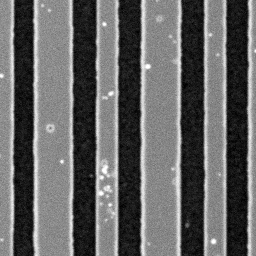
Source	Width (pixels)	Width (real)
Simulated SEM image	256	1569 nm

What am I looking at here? lines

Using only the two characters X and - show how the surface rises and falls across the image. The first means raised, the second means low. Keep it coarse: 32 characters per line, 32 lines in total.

XX--XXXXX---XXX---XXXXX---XX---X
XX--XXXXX---XXX---XXXXX---XX---X
XX--XXXXX---XXX---XXXXX---XX---X
XX--XXXXX---XXX---XXXXX---XX---X
XX--XXXXX---XXX---XXXXX---XX---X
XX--XXXXX---XXX---XXXXX---XX---X
XX--XXXXX---XXX---XXXXX---XX---X
XX--XXXXX---XXX---XXXXX---XX---X
XX--XXXXX---XXX---XXXXX---XX---X
XX--XXXXX---XXX---XXXXX---XX---X
XX--XXXXX---XXX---XXXXX---XX---X
XX--XXXXX---XXX---XXXXX---XX---X
XX--XXXXX---XXX---XXXX----XX---X
XX--XXXXX---XXX---XXXXX---XX---X
XX--XXXXX---XXX---XXXXX---XX---X
XX--XXXXX---XXX---XXXX----XX---X
XX--XXXXX---XXX---XXXXX---XX---X
XX--XXXXX---XXX---XXXXX---XX---X
XX--XXXXX---XXX---XXXXX---XX---X
XX--XXXXX---XXX---XXXXX---XX---X
XX--XXXXX---XXX---XXXX----XX---X
XX--XXXXX---XXX---XXXX----XX---X
XX--XXXXX---XXX---XXXX----XX---X
XX--XXXXX---XXX---XXXX----XX---X
XX--XXXXX---XXX---XXXX----XX---X
XX--XXXXX---XXX---XXXX----XX---X
XX--XXXXX---XXX---XXXX----XX---X
XX--XXXXX---XXX---XXXX----XX---X
XX--XXXXX---XXX---XXXX----XX---X
XX--XXXXX---XXX---XXXX----XX---X
XX--XXXXX---XXX---XXXX----XX---X
XX--XXXXX---XXX---XXXX----XX---X